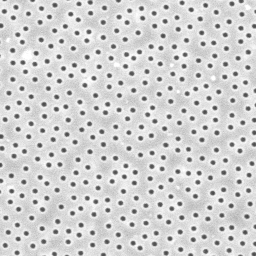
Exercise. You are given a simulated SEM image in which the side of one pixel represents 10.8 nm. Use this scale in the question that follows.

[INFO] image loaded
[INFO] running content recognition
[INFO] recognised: a regular array of holes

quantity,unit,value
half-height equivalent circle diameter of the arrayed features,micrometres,0.0646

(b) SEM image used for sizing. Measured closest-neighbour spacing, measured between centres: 123 nanometers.